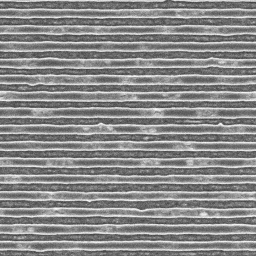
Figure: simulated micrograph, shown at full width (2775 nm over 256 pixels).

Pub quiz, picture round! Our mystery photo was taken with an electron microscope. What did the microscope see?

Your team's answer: parallel lines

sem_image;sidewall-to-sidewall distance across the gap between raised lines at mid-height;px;7.88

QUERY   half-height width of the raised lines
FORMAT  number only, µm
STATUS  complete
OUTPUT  0.0949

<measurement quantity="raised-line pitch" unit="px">16.6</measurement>